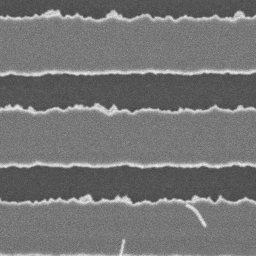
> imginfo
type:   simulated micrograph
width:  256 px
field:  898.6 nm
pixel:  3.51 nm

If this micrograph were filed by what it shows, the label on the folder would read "lines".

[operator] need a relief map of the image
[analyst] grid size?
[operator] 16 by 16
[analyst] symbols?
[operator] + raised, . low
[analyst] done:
................
++++++++++++++++
++++++++++++++++
++++++++++++++++
++++++++++++++++
................
................
++++++++++++++++
++++++++++++++++
++++++++++++++++
................
................
...++.....+.+..+
++++++++++++++++
++++++++++++++++
++++++++++++++++